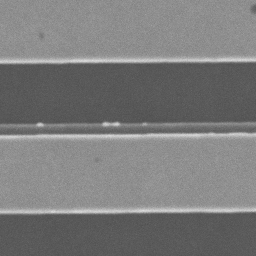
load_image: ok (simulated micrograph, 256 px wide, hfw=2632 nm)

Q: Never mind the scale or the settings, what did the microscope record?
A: lines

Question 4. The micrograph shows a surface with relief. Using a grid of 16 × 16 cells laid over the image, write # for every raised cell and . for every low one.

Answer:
################
################
################
################
................
................
................
................
################
################
################
################
################
................
................
................